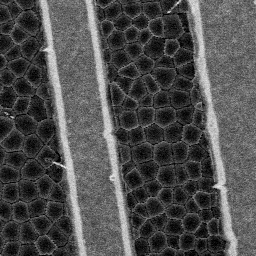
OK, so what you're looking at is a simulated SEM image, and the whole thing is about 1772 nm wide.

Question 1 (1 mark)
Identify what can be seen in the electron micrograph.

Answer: one or a few lines or trenches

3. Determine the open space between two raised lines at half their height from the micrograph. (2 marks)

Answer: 716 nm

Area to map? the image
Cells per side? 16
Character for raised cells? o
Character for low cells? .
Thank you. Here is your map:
...ooo......oooo
...ooo......oooo
...ooo.......ooo
...ooo.......ooo
...ooo.......ooo
....oo.......ooo
....ooo......ooo
....ooo......ooo
....ooo......ooo
....ooo......ooo
....ooo.......oo
....ooo.......oo
.....ooo......oo
.....ooo......oo
.....ooo......oo
.....ooo......oo